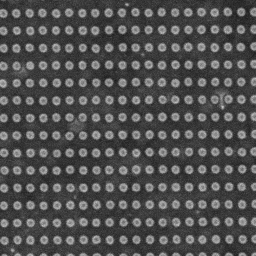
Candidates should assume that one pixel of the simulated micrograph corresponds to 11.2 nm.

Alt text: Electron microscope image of a regular array of raised bodies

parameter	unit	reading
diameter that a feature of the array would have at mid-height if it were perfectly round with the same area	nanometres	84.7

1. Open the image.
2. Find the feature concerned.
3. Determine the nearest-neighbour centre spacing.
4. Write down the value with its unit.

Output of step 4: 145 nm